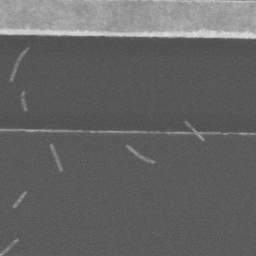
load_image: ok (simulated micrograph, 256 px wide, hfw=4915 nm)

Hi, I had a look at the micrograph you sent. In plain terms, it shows lines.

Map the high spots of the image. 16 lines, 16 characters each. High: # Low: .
################
################
................
................
................
................
................
................
................
................
................
................
................
................
................
................